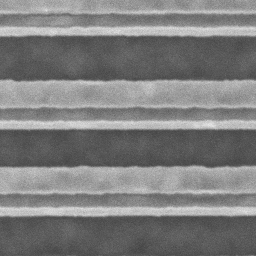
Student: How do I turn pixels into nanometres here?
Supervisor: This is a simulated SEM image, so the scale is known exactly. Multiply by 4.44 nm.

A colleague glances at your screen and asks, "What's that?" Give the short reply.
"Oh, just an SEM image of lines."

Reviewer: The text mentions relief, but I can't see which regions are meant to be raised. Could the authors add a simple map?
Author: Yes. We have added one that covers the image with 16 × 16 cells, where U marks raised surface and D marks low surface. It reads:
UUUUUUUUUUUUUUUU
UUUUUUUUUUUUUUUU
DDDDDDDDDDDDDDDD
DDDDDDDDDDDDDDDD
DDDDDDDDDDDDDDDD
UUUUUUUUUUUUUUUU
UUUUUUUUUUUUUUUU
UUUUUUUUUUUUUUUU
DDDDDDDDDDDDDDDD
DDDDDDDDDDDDDDDD
UUUUUUUUUUUUUUUU
UUUUUUUUUUUUUUUU
UUUUUUUUUUUUUUUU
DDDDDDDDDDDDDDDD
DDDDDDDDDDDDDDDD
DDDDDDDDDDDDDDDD